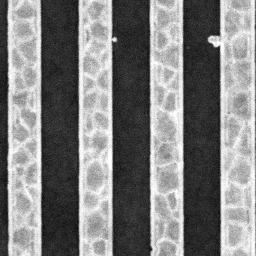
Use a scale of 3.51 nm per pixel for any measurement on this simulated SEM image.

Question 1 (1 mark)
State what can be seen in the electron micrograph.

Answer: one or a few lines or trenches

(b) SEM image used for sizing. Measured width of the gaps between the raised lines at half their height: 144 nanometers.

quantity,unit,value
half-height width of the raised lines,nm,106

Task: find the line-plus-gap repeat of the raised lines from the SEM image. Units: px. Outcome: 71